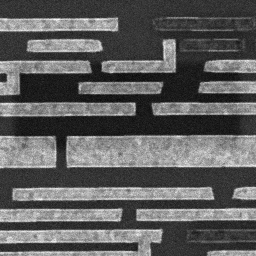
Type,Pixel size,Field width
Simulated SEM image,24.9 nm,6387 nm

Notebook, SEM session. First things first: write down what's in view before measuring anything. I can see wiring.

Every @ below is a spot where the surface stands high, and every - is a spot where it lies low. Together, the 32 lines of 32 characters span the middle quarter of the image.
@@@@@@----@@@@@@@@@@@@@@@@@@----
@@@@@@@---@@@@@@@@@@@@@@@@@@----
--------------------------------
--------------------------------
--------------------------------
----@@@@@@@@@@@@@@@@@@@@--------
----@@@@@@@@@@@@@@@@@@@@--------
--------------------------------
--------------------------------
--------------------------------
@@@@@@@@@@@@@@@@@@----@@@@@@@@@@
@@@@@@@@@@@@@@@@@@----@@@@@@@@@@
@@@@@@@@@@@@@@@@@@-----@@@------
--------------------------------
--------------------------------
--------------------------------
--------------------------------
--------------------------------
-@@@@@@@@@@@@@@@@@@@@@@@@@@@@@@@
-@@@@@@@@@@@@@@@@@@@@@@@@@@@@@@@
-@@@@@@@@@@@@@@@@@@@@@@@@@@@@@@@
-@@@@@@@@@@@@@@@@@@@@@@@@@@@@@@@
-@@@@@@@@@@@@@@@@@@@@@@@@@@@@@@@
-@@@@@@@@@@@@@@@@@@@@@@@@@@@@@@@
-@@@@@@@@@@@@@@@@@@@@@@@@@@@@@@@
-@@@@@@@@@@@@@@@@@@@@@@@@@@@@@@@
--------------------------------
--------------------------------
--------------------------------
--------------------------------
--------------------------------
@@@@@@@@@@@@@@@@@@@@@@@@@@@@@@@@